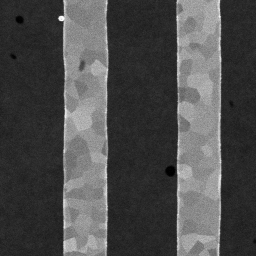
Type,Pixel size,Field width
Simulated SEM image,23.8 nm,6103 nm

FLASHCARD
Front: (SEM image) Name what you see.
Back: wiring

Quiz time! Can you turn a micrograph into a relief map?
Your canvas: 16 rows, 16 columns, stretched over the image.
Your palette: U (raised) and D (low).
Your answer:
DDDDUUUDDDDUUUDD
DDDDUUUDDDDUUUDD
DDDDUUUDDDDUUUDD
DDDDUUUDDDDUUUDD
DDDDUUUDDDDUUUDD
DDDDUUUDDDDUUUDD
DDDDUUUDDDDUUUDD
DDDDUUUDDDDUUUDD
DDDDUUUDDDDUUUDD
DDDDUUUDDDDUUUDD
DDDDUUUDDDDUUUDD
DDDDUUUDDDDUUUDD
DDDDUUUDDDDUUUDD
DDDDUUUDDDDUUUDD
DDDDUUUDDDDUUUDD
DDDDUUUDDDDUUUDD